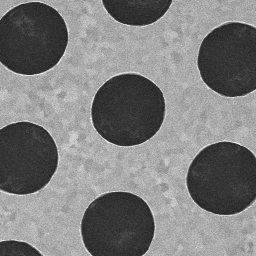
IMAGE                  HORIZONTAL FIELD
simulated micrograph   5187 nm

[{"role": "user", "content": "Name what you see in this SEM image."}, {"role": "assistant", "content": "holes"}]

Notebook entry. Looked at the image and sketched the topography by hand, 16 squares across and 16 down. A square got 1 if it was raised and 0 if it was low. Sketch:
1001111000011111
0000111101111101
0000111111111000
0000111111110000
1001111111110000
1111110000111000
1111110000111111
1111110000111111
0001110000111111
0000111111111000
0000111111110000
0001111111110000
1111110001110000
1111100000111111
1111100000111111
0011100001111111